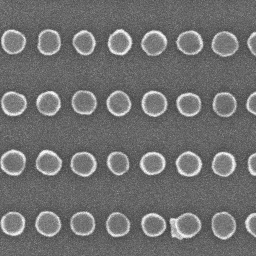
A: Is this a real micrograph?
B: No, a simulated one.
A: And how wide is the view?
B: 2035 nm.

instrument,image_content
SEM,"a regular array of raised bodies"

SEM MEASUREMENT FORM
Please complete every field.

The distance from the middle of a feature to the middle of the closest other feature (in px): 34.8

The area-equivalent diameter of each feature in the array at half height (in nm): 189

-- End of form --